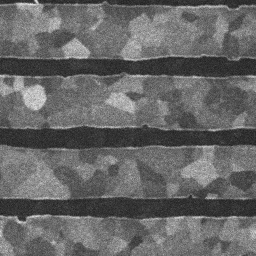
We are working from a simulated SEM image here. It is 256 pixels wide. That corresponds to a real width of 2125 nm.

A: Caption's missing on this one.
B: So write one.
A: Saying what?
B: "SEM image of one or a few lines or trenches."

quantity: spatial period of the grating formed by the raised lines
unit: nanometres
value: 586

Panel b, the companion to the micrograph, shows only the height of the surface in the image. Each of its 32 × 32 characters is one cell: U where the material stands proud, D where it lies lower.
DDUDUDDDDDDDDUDDDDDDDDDDDDDDDDDD
UUUUUUUUUUUUUUUUUUUUUUUUUUUUUUUU
UUUUUUUUUUUUUUUUUUUUUUUUUUUUUUUU
UUUUUUUUUUUUUUUUUUUUUUUUUUUUUUUU
UUUUUUUUUUUUUUUUUUUUUUUUUUUUUUUU
UUUUUUUUUUUUUUUUUUUUUUUUUUUUUUUU
UUUUUUUUUUUUUUUUUUUUUUUUUUUUUUUU
DDDDDDDDDDDDDDDDDDDDDDDDDDDDDDDD
DDDDDDDDDDDDDDDDDDDDDDDDDDDDDDDD
DDDDDDDDDUUUDDUUUDDDDDDDDDDDDDDD
UUUUUUUUUUUUUUUUUUUUUUUUUUUUUUUU
UUUUUUUUUUUUUUUUUUUUUUUUUUUUUUUU
UUUUUUUUUUUUUUUUUUUUUUUUUUUUUUUU
UUUUUUUUUUUUUUUUUUUUUUUUUUUUUUUU
UUUUUUUUUUUUUUUUUUUUUUUUUUUUUUUU
UUUUUUUUUUUUUUUUUUUUUUUUUUUUUUUU
DDDDDDDDDDDDDDDDDDDDDDDDDDDDDDDD
DDDDDDDDDDDDDDDDDDDDDDDDDDDDDDDD
UUDDDDDDDDDDDDUDDDUUUDUUUUUUUUUU
UUUUUUUUUUUUUUUUUUUUUUUUUUUUUUUU
UUUUUUUUUUUUUUUUUUUUUUUUUUUUUUUU
UUUUUUUUUUUUUUUUUUUUUUUUUUUUUUUU
UUUUUUUUUUUUUUUUUUUUUUUUUUUUUUUU
UUUUUUUUUUUUUUUUUUUUUUUUUUUUUUUU
UUUUUUUUUUUUUUUUUUUUUUUDUUUUUUUU
DDDDDDDDDDDDDDDDDDDDDDDDDDDDDDDD
DDDDDDDDDDDDDDDDDDDDDDDDDDDDDDDD
UUDUUUUUUUUUUUUUUDUUUUUUUUUUUUUU
UUUUUUUUUUUUUUUUUUUUUUUUUUUUUUUU
UUUUUUUUUUUUUUUUUUUUUUUUUUUUUUUU
UUUUUUUUUUUUUUUUUUUUUUUUUUUUUUUU
UUUUUUUUUUUUUUUUUUUUUUUUUUUUUUUU